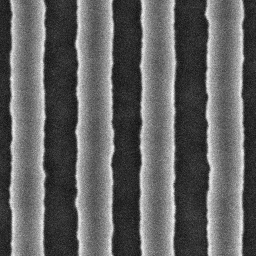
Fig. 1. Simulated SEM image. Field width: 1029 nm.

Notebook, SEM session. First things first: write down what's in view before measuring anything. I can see lines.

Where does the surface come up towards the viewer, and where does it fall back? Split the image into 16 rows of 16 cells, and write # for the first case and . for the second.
.##..##..##..##.
.##..##..##..##.
.##..##..##..##.
.##..##..##..##.
.##..##..##..##.
.##..##..##..##.
.##..##..##..##.
.##..##..##..##.
.##..##..##..##.
.##..##..##..##.
.##..##..##..##.
.##..##..##..##.
.##..##..##..##.
.##..##..##..##.
.##..##..##..##.
.##..##..##..##.